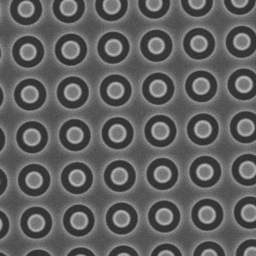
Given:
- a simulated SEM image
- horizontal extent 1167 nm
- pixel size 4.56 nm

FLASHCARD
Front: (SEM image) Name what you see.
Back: an array of small figures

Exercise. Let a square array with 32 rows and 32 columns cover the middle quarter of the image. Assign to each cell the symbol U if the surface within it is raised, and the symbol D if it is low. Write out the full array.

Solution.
UDDUUUUUUUUUUUUUUUUUUUUUUUUUUUUU
UUUUUUUUUUUUUUUUUUUUUUUUUUUUUUUU
UUUUUUUUUUUUUUUUUUUUUUDDDUUUUUUU
DDDDUUUUUUDDDDDDUUUUDDDDDDDUUUUD
DDDDDUUUUDDDDDDDUUUUDDDUUDDUUUDD
DUUDDDUUUDDUUUUDDUUDDDUUUDDDUUDD
UUUUDDUUUDDUUUUDDUUDDDUUUDDDUUDD
UUUUDDUUUDDUUUUDDUUUDDUUUDDUUUUD
DUUUDDUUUDDDUUDDDUUUDDDDDDDUUUUU
DDDDDDUUUUDDDDDDUUUUUDDDDDUUUUUU
DDDDDUUUUUUUDDUUUUUUUUUUUUUUUUUU
UUUUUUUUUUUUUUUUUUUUUUUUUUUUUUUU
UUUUUUUUUUUUUUUUUUUUUUUUUUUUUUUU
UUUUUUUUUUUUDDDUUUUUUUDDDDDUUUUU
DDDDDUUUUUDDDDDDUUUUUDDDDDDDUUUD
DDDDDDUUUUDDDUDDDUUUDDUUUUDDUUUD
DUUUDDDUUDDUUUUDDUUUDDUUUUDDUUUD
DUUUUDDUUDDUUUUDDDUUDDUUUUDDUUUD
DUUUUDDUUUDDUUUDDUUUDDDUUDDDUUUD
DDUUDDUUUUDDDDDDDUUUUDDDDDDUUUUU
DDDDDDUUUUUDDDDDUUUUUUDDDDUUUUUU
UDDDUUUUUUUUUDUUUUUUUUUUUUUUUUUU
UUUUUUUUUUUUUUUUUUUUUUUUUUUUUUUU
UUUUUUUUUUUUUUUUUUUUUUUDDDUUUUUU
UUUDUUUUUUUUDDDDUUUUUUDDDDDUUUUU
DDDDDDUUUUUDDDDDDUUUUDDDDDDDUUUD
DDDDDDDUUUDDUUUDDDUUUDDUUUDDDUUD
DDUUUDDUUUDDUUUUDDUUDDDUUUUDDUUD
DUUUUDDUUUDDUUUUDDUUUDDUUUDDUUUU
DDUUUDDUUUDDDUUDDDUUUDDDUDDDUUUU
DDDDDDDUUUUDDDDDDUUUUUDDDDDUUUUU
DDDDDDUUUUUUDDDDUUUUUUUUDUUUUUUU